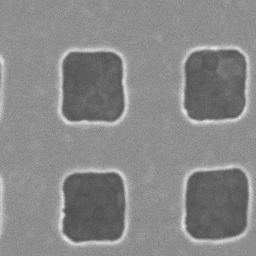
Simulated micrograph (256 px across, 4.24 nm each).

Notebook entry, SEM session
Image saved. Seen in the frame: holes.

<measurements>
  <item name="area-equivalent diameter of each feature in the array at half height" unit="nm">306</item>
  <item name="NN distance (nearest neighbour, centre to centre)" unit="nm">508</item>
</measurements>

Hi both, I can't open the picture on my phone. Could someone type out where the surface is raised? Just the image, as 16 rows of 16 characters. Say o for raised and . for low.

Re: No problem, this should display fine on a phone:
oooooooooooooooo
oooooooooooooooo
oooooooooooooooo
oooo...ooooo...o
oooo....oooo...o
oooo....oooo...o
oooo....oooo...o
oooo...ooooooooo
oooooooooooooooo
oooooooooooooooo
oooooooooooooooo
oooo....oooo....
oooo....oooo....
oooo....oooo...o
oooo....oooo...o
oooooooooooooooo